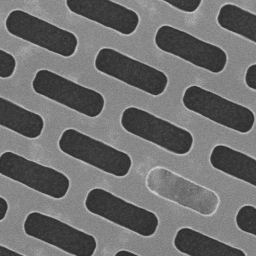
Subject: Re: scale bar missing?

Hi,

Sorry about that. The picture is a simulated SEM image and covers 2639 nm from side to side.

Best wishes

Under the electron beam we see a regular array of holes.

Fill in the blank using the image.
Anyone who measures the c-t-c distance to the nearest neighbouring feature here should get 670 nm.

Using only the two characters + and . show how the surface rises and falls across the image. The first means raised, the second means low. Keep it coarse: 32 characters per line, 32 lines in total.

++++++++.......++++++....+++++++
++.++++++........++++++++++....+
+....+++++++.....++++++++++.....
+......+++++++...+++..++++++....
++.......++++++++++.....++++++..
++++......++++++++++......++++++
.++++++..+++...++++++.......++++
..++++++++++.....++++++.....++++
..++++++++++.......++++++...+++.
.+++....++++++.......++++++++++.
++++......++++++.....++++++++++.
+++++.......++++++..+++...++++++
.++++++......++++++++++.....++++
...++++++....+++.++++++........+
.....++++++.+++....++++++.......
.....++++++++++.......++++++....
++...+++..++++++.......+++++++.+
++++++++....++++++......++++++++
++++++++......+++++++...+++..+++
...++++++.......++++++++++.....+
.....++++++.....++++++++++......
.......++++++...++++++++++++....
++.......++++++++++++..+++++++..
++++.....++++++++++++....+++++++
++++++..+++....++++++....+++++++
.++++++++++.....++++++..++++++++
.++++++++++........+++++++++++..
+++....+++++++......++++++++++..
+++......+++++++....++++++++++..
++++.......+++++++++++....++++++
++++++......++++++++++......++++
..++++++....+++.+++++++.......++